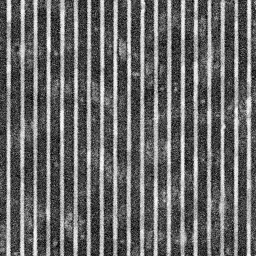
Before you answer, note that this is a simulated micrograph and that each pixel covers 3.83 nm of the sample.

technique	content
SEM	parallel lines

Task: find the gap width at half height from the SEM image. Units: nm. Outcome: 41.2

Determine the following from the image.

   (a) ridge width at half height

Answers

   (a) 2.25 px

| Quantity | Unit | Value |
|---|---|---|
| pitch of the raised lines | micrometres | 0.0511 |